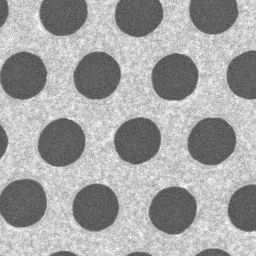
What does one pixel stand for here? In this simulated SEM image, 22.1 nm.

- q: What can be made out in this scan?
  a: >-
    holes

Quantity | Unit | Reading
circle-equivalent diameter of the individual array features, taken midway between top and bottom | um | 1.06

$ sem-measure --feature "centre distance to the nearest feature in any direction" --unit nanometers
1620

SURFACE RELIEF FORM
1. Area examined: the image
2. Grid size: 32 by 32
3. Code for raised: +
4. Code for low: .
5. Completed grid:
.++++......++++.....++++......++
.++++......+++......++++......++
.++++......+++......++++......++
++++++....+++++.....+++++....+++
+++++++.++++++++..++++++++++++++
++++++++++++++++++++++++++++++++
++.++++++++..++++++++++++++++++.
+....+++++....++++++....+++++...
......++++.....++++......+++....
......+++......++++......+++....
......+++......++++......+++....
+....+++++....+++++.....+++++...
+++++++++++++++++++++..+++++++++
++++++++++++++++++++++++++++++++
++++++++++++++++++++++++++++++++
++++++....+++++....++++++....+++
.++++.....+++++.....++++.....+++
.++++......+++......+++.......++
.++++......+++......+++......+++
+++++.....+++++....+++++.....+++
++++++...++++++++++++++++..+++++
++++++++++++++++++++++++++++++++
++..++++++++++++++++++++++++++++
+....+++++....+++++++..+++++++..
......+++......++++.....+++++...
......+++......++++......++++...
......+++......++++......+++....
+....++++.....+++++.....+++++...
++++++++++...+++++++...+++++++..
++++++++++++++++++++++++++++++++
++++++++++++++++++++++++++++++++
+++++++..++++++++.+++++++...++++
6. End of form